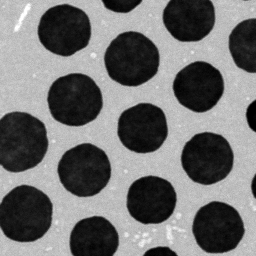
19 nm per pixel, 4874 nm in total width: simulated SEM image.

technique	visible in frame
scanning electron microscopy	a regular array of holes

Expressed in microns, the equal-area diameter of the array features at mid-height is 1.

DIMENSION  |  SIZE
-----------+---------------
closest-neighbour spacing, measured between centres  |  1330 nanometres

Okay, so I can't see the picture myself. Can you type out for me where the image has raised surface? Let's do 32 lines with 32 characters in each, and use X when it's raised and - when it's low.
XXXXXXXXXXXXX----XXXX------XXXXX
XXXXXX-----XXX--XXXX-------XXXXX
XXXXX------XXXXXXXXX-------XXXX-
XXXXX------XXXXXXXXXX------XX---
XXXXX------XXXX---XXXX----XXX---
XXXXX------XXX-----XXXXXXXXXX---
XXXXXX----XXX-------XXXXXXXXX---
XXXXXXXXXXXXX-------XXXXXXXXX---
XXXXXXXXXXXXX-------XXX----XXX--
XXXXXXXX---XXX-----XXX------XXXX
XXXXXX------XXX---XXXX------XXXX
XXXXXX-------XXXXXXXXX------XXXX
XXXXXX-------XXXXXXXXX-----XXXXX
XXXXXX-------XXX----XXX----XXXX-
----XXX-----XXX------XXXXXXXXXX-
-----XXX---XXXX------XXXXXXXXXX-
------XXXXXXXXX------XXXXXXXXXXX
------XXXXXXXXX------XXX----XXXX
------XXX---XXXX----XXX------XXX
------XX-----XXXXXXXXXX------XXX
-----XX-------XXXXXXXXX------XXX
X--XXXX-------XXXXXXXXX------XXX
XXXXXXXX------XXX----XXX----XXXX
XX--XXXX-----XXX------XXXXXXXXX-
X-----XXXX--XXXX------XXXXXXXXXX
------XXXXXXXXXX------XXXX--XXXX
-------XXXXXXXXX------XXX-----XX
------XXXX---XXXX----XXX------XX
------XXX-----XXXXXXXXXX-------X
X----XXXX------XXXXXXXXX------XX
XXXXXXXXX------XXXXXXXXXX-----XX
XXXXXXXXX-----XXXX----XXXX--XXXX